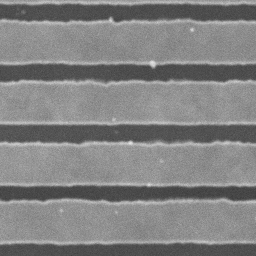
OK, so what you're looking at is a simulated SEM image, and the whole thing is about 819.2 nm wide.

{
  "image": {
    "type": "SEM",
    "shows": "lines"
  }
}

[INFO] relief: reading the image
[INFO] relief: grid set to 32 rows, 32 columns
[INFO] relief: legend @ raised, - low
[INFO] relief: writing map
@@@@@@@@--@@@@@@@@---@@-@@@@@@@@
--------------------------------
@------------@--------@@--------
@@@@@@@@@@@@@@@@@@@@@@@@@@@@@@@@
@@@@@@@@@@@@@@@@@@@@@@@@@@@@@@@@
@@@@@@@@@@@@@@@@@@@@@@@@@@@@@@@@
@@@@@@@@@@@@@@@@@@@@@@@@@@@@@@@@
@@@@@@@@@@@@@@@@@@@@@@@@@@@@@@@@
--------------------------------
--------------------------------
@@@@@@@@@@@@@@@@@@@@@@@@@@@@@@@@
@@@@@@@@@@@@@@@@@@@@@@@@@@@@@@@@
@@@@@@@@@@@@@@@@@@@@@@@@@@@@@@@@
@@@@@@@@@@@@@@@@@@@@@@@@@@@@@@@@
@@@@@@@@@@@@@@@@@@@@@@@@@@@@@@@@
-------------@@-------@@@--@@---
--------------------------------
--------------------------------
@@@@@@@@@@@@@@@@@@@@@@@@@@@@@@@@
@@@@@@@@@@@@@@@@@@@@@@@@@@@@@@@@
@@@@@@@@@@@@@@@@@@@@@@@@@@@@@@@@
@@@@@@@@@@@@@@@@@@@@@@@@@@@@@@@@
@@@@@@@@@@@@@@@@@@@@@@@@@@@@@@@@
--------------------------------
--------------------------------
@@@@@@@@@@@@@@@@@@@@@@@@@@@@@@@@
@@@@@@@@@@@@@@@@@@@@@@@@@@@@@@@@
@@@@@@@@@@@@@@@@@@@@@@@@@@@@@@@@
@@@@@@@@@@@@@@@@@@@@@@@@@@@@@@@@
@@@@@@@@@@@@@@@@@@@@@@@@@@@@@@@@
-------@@-----------------------
--------------------------------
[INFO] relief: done